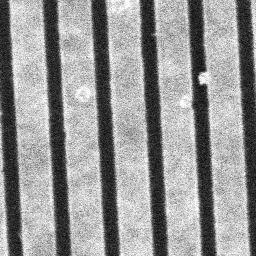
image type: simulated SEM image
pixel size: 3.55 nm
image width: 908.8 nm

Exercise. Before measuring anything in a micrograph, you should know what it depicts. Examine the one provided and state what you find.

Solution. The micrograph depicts parallel lines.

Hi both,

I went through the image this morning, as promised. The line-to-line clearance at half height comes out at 13.5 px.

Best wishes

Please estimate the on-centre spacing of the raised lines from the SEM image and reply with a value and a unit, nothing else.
171 nm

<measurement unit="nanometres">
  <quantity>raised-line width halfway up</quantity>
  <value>122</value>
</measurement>